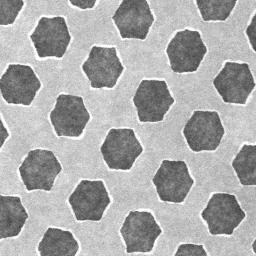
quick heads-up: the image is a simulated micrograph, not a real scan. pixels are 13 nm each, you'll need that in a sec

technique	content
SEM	a regular array of holes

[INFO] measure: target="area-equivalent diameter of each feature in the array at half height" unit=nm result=540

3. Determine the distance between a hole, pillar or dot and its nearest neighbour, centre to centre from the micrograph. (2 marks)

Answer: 768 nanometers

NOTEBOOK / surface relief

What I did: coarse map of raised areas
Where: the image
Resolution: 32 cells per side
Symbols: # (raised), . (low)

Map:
...######...###....######.....##
...###########.....######....###
..###...######.....#######..###.
####.....######....############.
####.....######...####...######.
####.....############.....#####.
####....###....######.....######
###########....######....#######
#...######.....######....###...#
.....######....############.....
.....######...####...######.....
.....############....######.....
#...###...#######.....######...#
#######....######....###########
######.....######....###...#####
.#####.....############.....####
.######...####...######.....####
.############....######.....####
#############.....######...###..
###....######....############...
###.....#####....###...######...
##......############....#####...
###....###.########.....######..
###...###....######.....########
..#######.....######...###...###
...######.....############....##
...######....###...######......#
...#######..####...######.....##
...###.########.....######....##
..###....######.....############
#####.....######...####.########
#####.....######...###....######